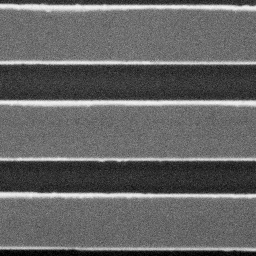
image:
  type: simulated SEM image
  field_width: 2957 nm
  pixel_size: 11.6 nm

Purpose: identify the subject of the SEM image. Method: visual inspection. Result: lines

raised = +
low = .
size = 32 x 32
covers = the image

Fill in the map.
................................
++++++++++++++++++++++++++++++++
++++++++++++++++++++++++++++++++
++++++++++++++++++++++++++++++++
++++++++++++++++++++++++++++++++
++++++++++++++++++++++++++++++++
++++++++++++++++++++++++++++++++
++++++++++++++++++++++++++++++++
................................
................................
................................
................................
................................
++++++++++++++++++++++++++++++++
++++++++++++++++++++++++++++++++
++++++++++++++++++++++++++++++++
++++++++++++++++++++++++++++++++
++++++++++++++++++++++++++++++++
++++++++++++++++++++++++++++++++
++++++++++++++++++++++++++++++++
................................
................................
................................
................................
++++++++++++++++++++++++++++++++
++++++++++++++++++++++++++++++++
++++++++++++++++++++++++++++++++
++++++++++++++++++++++++++++++++
++++++++++++++++++++++++++++++++
++++++++++++++++++++++++++++++++
++++++++++++++++++++++++++++++++
................................